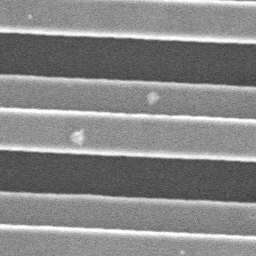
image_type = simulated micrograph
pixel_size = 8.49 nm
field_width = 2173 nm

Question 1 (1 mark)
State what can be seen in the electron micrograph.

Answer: lines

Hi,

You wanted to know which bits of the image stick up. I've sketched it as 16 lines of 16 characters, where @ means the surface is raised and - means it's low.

@@@@@@@@@@@@@@@@
@@@@@@@@@@@@@@@@
-----------@@@@@
----------------
----------------
@@@@@@@@@@@@@@@@
@@@@@@@@@@@@@@@@
@@@@@@@@@@@@@@@@
@@@@@@@@@@@@@@@@
----@@@@@@@@@@@@
----------------
----------------
@@@@@@@@@@@-----
@@@@@@@@@@@@@@@@
@@@@@@@@@@@@@@@@
@@@@@@@@@@@@@@@@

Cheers